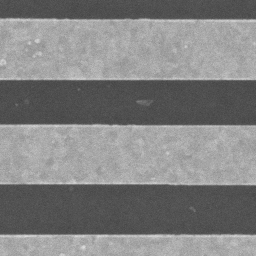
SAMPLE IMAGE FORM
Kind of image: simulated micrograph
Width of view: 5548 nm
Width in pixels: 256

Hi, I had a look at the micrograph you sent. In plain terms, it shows lines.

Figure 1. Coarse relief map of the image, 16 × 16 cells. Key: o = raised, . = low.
................
oooooooooooooooo
oooooooooooooooo
oooooooooooooooo
oooooooooooooooo
................
................
................
oooooooooooooooo
oooooooooooooooo
oooooooooooooooo
............oooo
................
................
................
oooooooooooooooo